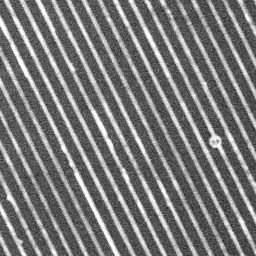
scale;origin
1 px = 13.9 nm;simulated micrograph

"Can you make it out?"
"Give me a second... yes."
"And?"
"parallel lines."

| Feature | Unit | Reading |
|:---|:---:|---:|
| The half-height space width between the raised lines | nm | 157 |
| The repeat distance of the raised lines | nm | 194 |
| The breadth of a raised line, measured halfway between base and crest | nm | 38.8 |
